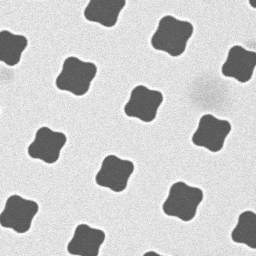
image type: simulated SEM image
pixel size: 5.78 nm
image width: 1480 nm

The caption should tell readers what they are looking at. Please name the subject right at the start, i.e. holes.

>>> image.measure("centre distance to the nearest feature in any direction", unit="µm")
0.422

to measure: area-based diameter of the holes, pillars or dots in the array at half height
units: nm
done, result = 206